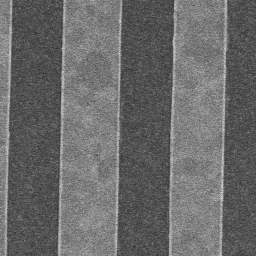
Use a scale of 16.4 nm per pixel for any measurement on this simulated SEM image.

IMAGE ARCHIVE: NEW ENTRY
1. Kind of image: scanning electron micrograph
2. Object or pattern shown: one or a few lines or trenches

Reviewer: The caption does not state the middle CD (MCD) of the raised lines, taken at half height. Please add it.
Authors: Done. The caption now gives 889 nanometres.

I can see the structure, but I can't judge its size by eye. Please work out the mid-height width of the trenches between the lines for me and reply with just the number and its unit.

888 nanometres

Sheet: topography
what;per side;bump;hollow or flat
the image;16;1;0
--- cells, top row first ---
1000111100011100
1000111100011100
1000111000011100
1000111000011100
1000111000011100
1000111000011100
1000111000011100
0000111000011100
1000111000011100
0000111000011100
0000111000011100
0000111000011100
0000111000011100
0000111000011100
0000111000011100
0000111000011100